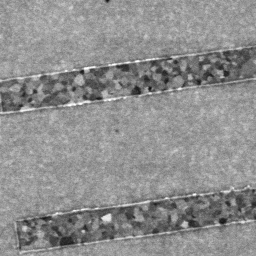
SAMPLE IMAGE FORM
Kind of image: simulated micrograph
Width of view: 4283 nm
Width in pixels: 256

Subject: one or a few lines or trenches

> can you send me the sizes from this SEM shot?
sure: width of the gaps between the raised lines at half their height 1.8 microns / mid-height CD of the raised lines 547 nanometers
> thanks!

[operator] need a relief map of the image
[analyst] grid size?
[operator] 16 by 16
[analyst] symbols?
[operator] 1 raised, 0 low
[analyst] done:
0000000000000000
0000000000000000
0000000000000000
0000000000001111
0000111111111111
1111111111110000
1111100000000000
0000000000000000
0000000000000000
0000000000000000
0000000000000000
0000000000000000
0000000000111111
0001111111111111
0111111111100000
0110000000000000